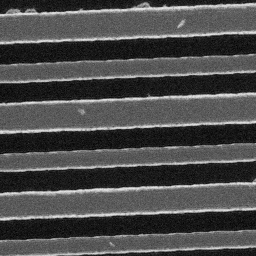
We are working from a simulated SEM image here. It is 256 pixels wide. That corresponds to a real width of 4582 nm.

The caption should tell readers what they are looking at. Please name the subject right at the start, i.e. lines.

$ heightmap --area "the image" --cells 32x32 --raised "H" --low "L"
LLLLLLLLLLLLLLLLLLLLLLLLLLLLLLLH
LLLLLLLLHHHHHHHHHHHHHHHHHHHHHHHH
HHHHHHHHHHHHHHHHHHHHHHHHHHHHHHHH
HHHHHHHHHHHHHHHHHHHHHHHHHHHHHHHH
HHHHHHHHHHHHHHHHHHHHHHLLLLLLLLLL
LLLLLLLLLLLLLLLLLLLLLLLLLLLLLLLL
LLLLLLLLLLLLLLLLLLLLLLLLLLLLLLLL
LLLLLLLLLLLLLLLLHHHHHHHHHHHHHHHH
HHHHHHHHHHHHHHHHHHHHHHHHHHHHHHHH
HHHHHHHHHHHHHHHHHHHLLLLLLLLLLLLL
LLLLLLLLLLLLLLLLLLLLLLLLLLLLLLLL
LLLLLLLLLLLLLLLLLLLLLLLLLLLLLLLL
LLLLLLLLLLLLLHHHHHHHHHHHHHHHHHHH
HHHHHHHHHHHHHHHHHHHHHHHHHHHHHHHH
HHHHHHHHHHHHHHHHHHHHHHHHHHHHHHHH
HHHHHHHHHHHHHHHHHHHHHHHHHHHLLLLL
HHLLLLLLLLLLLLLLLLLLLLLLLLLLLLLL
LLLLLLLLLLLLLLLLLLLLLLLLLLLLLLLL
LLLLLLLLLLLLLLLLLLLLHHHHHHHHHHHH
HHHHHHHHHHHHHHHHHHHHHHHHHHHHHHHH
HHHHHHHHHHHHHHHHHHHHHHLLLLLLLLLL
LLLLLLLLLLLLLLLLLLLLLLLLLLLLLLLL
LLLLLLLLLLLLLLLLLLLLLLLLLLLLLLLL
LLLLLLLLLLLLLLLHHHHHHHHHHHHHHHHH
HHHHHHHHHHHHHHHHHHHHHHHHHHHHHHHH
HHHHHHHHHHHHHHHHHHHHHHHHHHHHHHHH
HHHHHHHHHHHHHHHHHHHHHLLLLLLLLLLL
LLLLLLLLLLLLLLLLLLLLLLLLLLLLLLLL
LLLLLLLLLLLLLLLLLLLLLLLLLLLLLLLL
LLLLLLLLLLLLLLHHHHHHHHHHHHHHHHHH
HHHHHHHHHHHHHHHHHHHHHHHHHHHHHHHH
HHHHHHHHHHHHHHHLLLLLLLLLLLLLLLLL